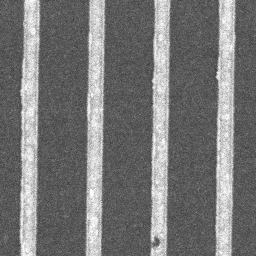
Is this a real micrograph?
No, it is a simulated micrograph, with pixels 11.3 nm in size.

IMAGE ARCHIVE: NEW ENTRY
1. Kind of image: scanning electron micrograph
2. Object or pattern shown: one or a few lines or trenches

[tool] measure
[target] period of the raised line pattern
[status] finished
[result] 739 nm